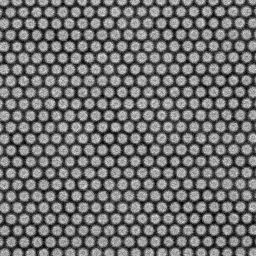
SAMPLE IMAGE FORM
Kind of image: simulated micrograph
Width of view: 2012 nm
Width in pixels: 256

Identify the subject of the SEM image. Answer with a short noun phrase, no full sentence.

a regular array of raised bodies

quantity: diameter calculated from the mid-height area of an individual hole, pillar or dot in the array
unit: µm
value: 0.0737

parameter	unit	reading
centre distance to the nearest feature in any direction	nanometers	102